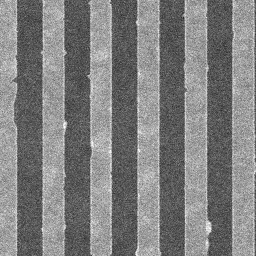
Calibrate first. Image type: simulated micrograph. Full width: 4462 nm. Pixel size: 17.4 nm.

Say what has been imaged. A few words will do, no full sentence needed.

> parallel lines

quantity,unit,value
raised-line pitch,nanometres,827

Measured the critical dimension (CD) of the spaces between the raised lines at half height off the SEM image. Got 466 nm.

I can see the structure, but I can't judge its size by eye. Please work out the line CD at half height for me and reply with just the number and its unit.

0.364 microns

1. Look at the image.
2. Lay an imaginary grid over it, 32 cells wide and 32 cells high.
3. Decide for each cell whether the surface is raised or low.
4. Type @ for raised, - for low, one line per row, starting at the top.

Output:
@@---@@@---@@@---@@@---@@@---@@@
@@---@@@---@@@---@@@---@@@---@@@
@@---@@@---@@@---@@@---@@@---@@@
@@---@@@---@@@---@@@---@@@---@@@
@@---@@@---@@@---@@@---@@@---@@@
@@---@@@---@@@---@@@---@@@---@@@
@@---@@@---@@@---@@@---@@@---@@@
@@---@@@---@@@---@@@---@@@---@@@
@@---@@@---@@@---@@@---@@@---@@@
@@---@@@---@@@---@@@---@@@---@@@
@@---@@@---@@@---@@@---@@@---@@@
@@---@@@---@@@---@@@---@@@---@@@
@@---@@@---@@@---@@@---@@@---@@@
@@---@@@---@@@---@@@---@@@---@@@
@@---@@@---@@@---@@@---@@@---@@@
@@---@@@---@@@---@@@---@@@---@@@
@@---@@@---@@@---@@@---@@@---@@@
@@---@@@---@@@---@@@---@@@---@@@
@@---@@@---@@@---@@@---@@@---@@@
@@---@@@---@@@---@@@---@@@---@@@
@@---@@@---@@@---@@@---@@@---@@@
@@---@@@---@@@---@@@---@@@---@@@
@@---@@@---@@@---@@@---@@@---@@@
@@---@@@---@@@---@@@---@@@---@@@
@@---@@@---@@@---@@@---@@@---@@@
@@---@@@---@@@---@@@---@@@---@@@
@@---@@@---@@@---@@@---@@@---@@@
@@---@@@---@@@---@@@---@@@---@@@
@@---@@@---@@@---@@@---@@@---@@@
@@---@@@---@@@---@@@---@@@---@@@
@@---@@@---@@@---@@@---@@@---@@@
@@---@@@---@@@---@@@---@@@---@@@